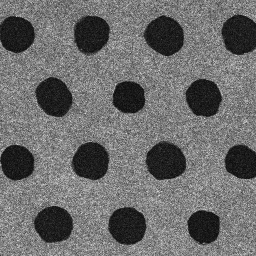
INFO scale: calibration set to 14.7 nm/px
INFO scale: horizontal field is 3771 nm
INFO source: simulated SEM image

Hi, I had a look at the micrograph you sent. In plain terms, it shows a regular array of holes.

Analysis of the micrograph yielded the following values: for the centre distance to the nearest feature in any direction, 1080 nanometers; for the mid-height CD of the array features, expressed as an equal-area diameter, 37.2 px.